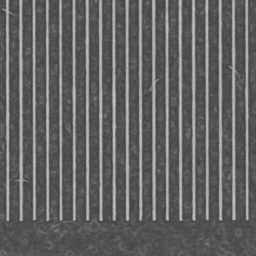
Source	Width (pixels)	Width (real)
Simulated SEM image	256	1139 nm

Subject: parallel lines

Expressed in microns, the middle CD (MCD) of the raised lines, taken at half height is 0.0111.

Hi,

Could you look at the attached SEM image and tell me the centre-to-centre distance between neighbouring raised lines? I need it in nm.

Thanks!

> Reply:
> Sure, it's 59.1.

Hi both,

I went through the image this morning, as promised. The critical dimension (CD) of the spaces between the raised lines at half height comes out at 47.8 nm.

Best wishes